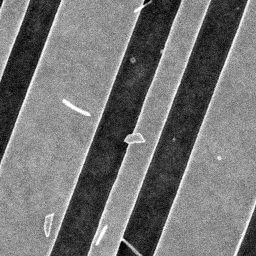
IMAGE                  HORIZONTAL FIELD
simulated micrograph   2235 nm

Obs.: lines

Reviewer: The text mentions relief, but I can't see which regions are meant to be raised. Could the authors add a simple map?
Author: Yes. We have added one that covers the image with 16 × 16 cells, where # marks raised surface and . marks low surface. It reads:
##..#####..##..#
#..#####...##..#
#..#####..##...#
#..#####..##..##
..#####...#...##
..#####..##..###
.######..##..###
.#####...#...###
.#####..##..####
#####...##..####
#####...#...####
#####..##..#####
####...##..#####
####..##...#####
####..##..#####.
###...#...#####.